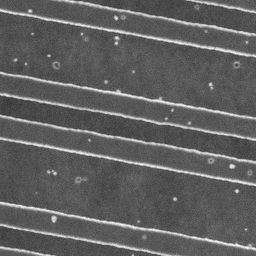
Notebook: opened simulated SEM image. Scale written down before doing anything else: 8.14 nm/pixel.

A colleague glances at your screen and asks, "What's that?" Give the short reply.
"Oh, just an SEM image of lines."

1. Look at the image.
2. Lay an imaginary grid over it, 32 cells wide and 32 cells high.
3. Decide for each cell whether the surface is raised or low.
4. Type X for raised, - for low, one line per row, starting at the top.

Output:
XXXXXXXXXXX---------------XXXXXX
-XXXXXXXXXXXXXXXX---------------
------XXXXXXXXXXXXXXXX----------
------------XXXXXXXXXXXXXXXX----
------------------XXXXXXXXXXXXXX
-----------------------XXXXXXXXX
-----------------------------XXX
--------------------------------
--------------------------------
XXX-----------------------------
XXXXXXXX------------------------
XXXXXXXXXXXXXX------------------
---XXXXXXXXXXXXXXXX-------------
---------XXXXXXXXXXXXXXXX-------
---------------XXXXXXXXXXXXXXX--
XXXXX---------------XXXXXXXXXXXX
XXXXXXXXXXX---------------XXXXXX
-XXXXXXXXXXXXXXXX---------------
-------XXXXXXXXXXXXXXXX---------
------------XXXXXXXXXXXXXXXX----
-----------------XXXXXXXXXXXXXXX
-----------------------XXXXXXXXX
----------------------------XXXX
--------------------------------
--------------------------------
X-------------------------------
XXXXXXX-------------------------
XXXXXXXXXXXX--------------------
-XXXXXXXXXXXXXXXXX--------------
-------XXXXXXXXXXXXXXXX---------
-------------XXXXXXXXXXXXXXXX---
XXXX--------------XXXXXXXXXXXXXX